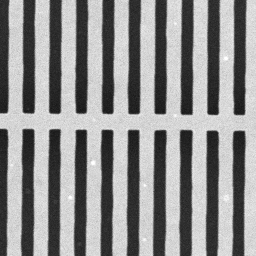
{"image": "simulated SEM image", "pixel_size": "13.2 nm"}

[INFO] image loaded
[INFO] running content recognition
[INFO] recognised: groups of lines, slits or small figures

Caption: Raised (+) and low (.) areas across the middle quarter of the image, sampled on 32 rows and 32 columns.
+++...+++....+++...++++...+++...
+++...+++....+++...++++...+++...
+++...+++....+++...++++...+++...
+++...+++....+++...++++...+++...
+++...+++....+++...++++...+++...
+++...+++....+++...++++...+++...
+++...+++....+++...++++...+++...
+++...+++....+++...+++....+++...
+++...+++....+++...+++....+++...
+++...+++....+++...++++...+++...
+++...+++....+++...++++...+++...
+++...+++....+++...++++...+++...
+++..+++++..++++...++++..++++...
++++++++++++++++++++++++++++++++
++++++++++++++++++++++++++++++++
++++++++++++++++++++++++++++++++
+++..+++++..++++...++++..++++...
+++...+++....+++...+++....+++...
+++...+++....+++...+++....+++...
+++...+++....+++...+++....+++...
+++...+++....+++...+++....+++...
+++...+++....+++...+++....+++...
+++...+++....+++...+++....+++...
+++...+++....+++...+++....+++...
+++...+++....+++...+++....+++...
+++...+++...++++...+++....+++...
+++...+++...++++...+++....+++...
+++...+++...++++...+++....+++...
+++...+++...++++...+++....+++...
+++...+++...++++...+++....+++...
+++...+++...++++...+++....+++...
+++...+++...++++...+++....+++...